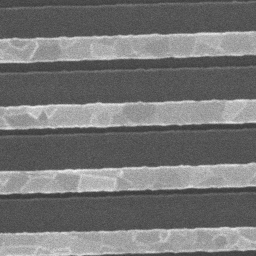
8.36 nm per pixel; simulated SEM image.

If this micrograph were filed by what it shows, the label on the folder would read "lines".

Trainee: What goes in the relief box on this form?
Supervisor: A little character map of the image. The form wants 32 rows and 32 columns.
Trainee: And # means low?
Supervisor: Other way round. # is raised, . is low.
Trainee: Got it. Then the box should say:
................................
................................
................................
................................
...............#################
################################
################################
###########.....................
................................
................................
................................
................................
................................
################################
################################
#########################.......
................................
................................
................................
................................
...............................#
################################
################################
#######################.........
................................
................................
................................
................................
...........................#####
################################
################################
####################.##.........